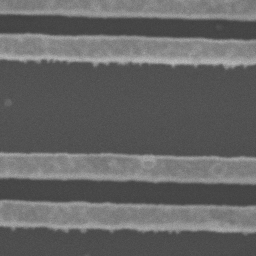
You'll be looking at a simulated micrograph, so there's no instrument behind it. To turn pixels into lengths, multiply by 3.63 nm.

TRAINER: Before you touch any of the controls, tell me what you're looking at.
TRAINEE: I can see lines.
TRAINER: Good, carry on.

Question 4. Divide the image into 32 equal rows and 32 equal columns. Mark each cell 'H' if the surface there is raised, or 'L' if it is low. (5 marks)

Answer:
HHHHHHHHHHHHHHHHHHHHHHHHHHHHHHHH
HHHHHHHHHHHHHHHHHHHHHHHHHHHHHHHH
LLLLLLLLLLLLLLLLLLLLLLLLLLLLLLLL
LLLLLLLLLLLLLLLLLLLLLLLLLLLLLLLL
HHHHHHHHLLHHHHLHLLLLLLLLLLLLLLLL
HHHHHHHHHHHHHHHHHHHHHHHHHHHHHHHH
HHHHHHHHHHHHHHHHHHHHHHHHHHHHHHHH
LLLLLLLLHHHHHHHHHHHHHHHHHHHHHHHH
LLLLLLLLLLLLLLLLLLLLLLLLLLLLLLLL
LLLLLLLLLLLLLLLLLLLLLLLLLLLLLLLL
LLLLLLLLLLLLLLLLLLLLLLLLLLLLLLLL
LLLLLLLLLLLLLLLLLLLLLLLLLLLLLLLL
LLLLLLLLLLLLLLLLLLLLLLLLLLLLLLLL
LLLLLLLLLLLLLLLLLLLLLLLLLLLLLLLL
LLLLLLLLLLLLLLLLLLLLLLLLLLLLLLLL
LLLLLLLLLLLLLLLLLLLLLLLLLLLLLLLL
LLLLLLLLLLLLLLLLLLLLLLLLLLLLLLLL
LLLLLLLLLLLLLLLLLLLLLLLLLLLLLLLL
LLLLLLLLLLLLLLLLLLLLLLLLLLLLLLLL
HHHHHHHHHHHHHHHHHHHLLLLLLLLLLLLL
HHHHHHHHHHHHHHHHHHHHHHHHHHHHHHHH
HHHHHHHHHHHHHHHHHHHHHHHHHHHHHHHH
LLLLLLLLLLLLLLLLLLHHHHHHHHHHHHHH
LLLLLLLLLLLLLLLLLLLLLLLLLLLLLLLL
LLLLLLLLLLLLLLLLLLLLLLLLLLLLLLLL
HHHHHHHHHHHHHHHLLLLLLLLLLLLLLLLL
HHHHHHHHHHHHHHHHHHHHHHHHHHHHHHHH
HHHHHHHHHHHHHHHHHHHHHHHHHHHHHHHH
LLLLLLLLHLLLHHHHHHHHHHHHHHHHHHHH
LLLLLLLLLLLLLLLLLLLLLLLLLLLLLLLL
LLLLLLLLLLLLLLLLLLLLLLLLLLLLLLLL
LLLLLLLLLLLLLLLLLLLLLLLLLLLLLLLL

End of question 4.